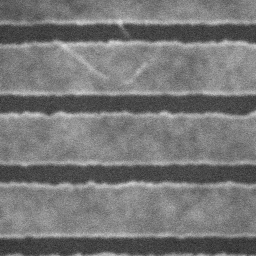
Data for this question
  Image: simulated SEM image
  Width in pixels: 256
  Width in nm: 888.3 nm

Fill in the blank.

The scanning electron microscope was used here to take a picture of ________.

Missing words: lines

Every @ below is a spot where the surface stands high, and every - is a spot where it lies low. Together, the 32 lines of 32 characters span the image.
@@@@@@@@@@@@@@@@@@@@@@@@@@@@@@@@
@@@@@@@@@@@@@@@@@@@@@@@@@@@@@@@@
@@@@@@@@@@@@@@@@@@@@@@@@@@@@@@@@
--------------------------------
--------------------------------
----@@@@@@@@@@@@@@@@@@@-@@@@@@@-
@@@@@@@@@@@@@@@@@@@@@@@@@@@@@@@@
@@@@@@@@@@@@@@@@@@@@@@@@@@@@@@@@
@@@@@@@@@@@@@@@@@@@@@@@@@@@@@@@@
@@@@@@@@@@@@@@@@@@@@@@@@@@@@@@@@
@@@@@@@@@@@@@@@@@@@@@@@@@@@@@@@@
@@@@@@@@@@@@@@@@@@@@@@@@@@@@@@@@
--------------------------------
--------------------------------
@@@@@@@@@@@@@@@@@@@@@@@@@@@@@--@
@@@@@@@@@@@@@@@@@@@@@@@@@@@@@@@@
@@@@@@@@@@@@@@@@@@@@@@@@@@@@@@@@
@@@@@@@@@@@@@@@@@@@@@@@@@@@@@@@@
@@@@@@@@@@@@@@@@@@@@@@@@@@@@@@@@
@@@@@@@@@@@@@@@@@@@@@@@@@@@@@@@@
--@@-----@@--@@-@--@@-------@---
--------------------------------
--------------------------------
@@@@@@@@@@@@@@@@@@@@@@@@@@@@@@@@
@@@@@@@@@@@@@@@@@@@@@@@@@@@@@@@@
@@@@@@@@@@@@@@@@@@@@@@@@@@@@@@@@
@@@@@@@@@@@@@@@@@@@@@@@@@@@@@@@@
@@@@@@@@@@@@@@@@@@@@@@@@@@@@@@@@
@@@@@@@@@@@@@@@@@@@@@@@@@@@@@@@@
@@@@@@@@@@@@@@@@@@@@@@@@@@-@@@@@
--------------------------------
--------------------------------